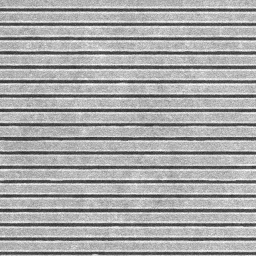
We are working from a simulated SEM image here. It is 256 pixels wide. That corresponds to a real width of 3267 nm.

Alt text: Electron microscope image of parallel lines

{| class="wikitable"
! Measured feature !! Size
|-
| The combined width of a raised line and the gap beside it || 14.3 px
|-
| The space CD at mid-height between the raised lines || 57.4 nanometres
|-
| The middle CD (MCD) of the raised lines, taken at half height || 0.126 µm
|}